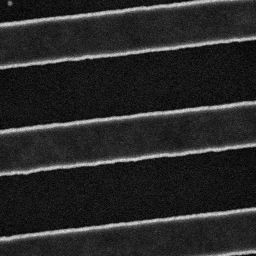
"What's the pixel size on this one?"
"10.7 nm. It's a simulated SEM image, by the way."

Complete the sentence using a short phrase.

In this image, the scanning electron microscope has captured lines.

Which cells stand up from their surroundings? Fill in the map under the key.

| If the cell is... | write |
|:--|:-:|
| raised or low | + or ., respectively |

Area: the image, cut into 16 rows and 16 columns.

.........+++++++
++++++++++++++++
++++++++++++++++
+++++++.........
................
................
...............+
......++++++++++
++++++++++++++++
+++++++++++++...
++++............
................
................
............++++
...+++++++++++++
++++++++++++++++